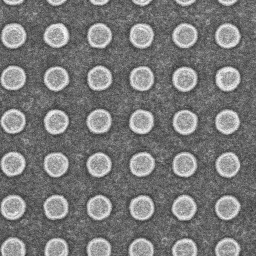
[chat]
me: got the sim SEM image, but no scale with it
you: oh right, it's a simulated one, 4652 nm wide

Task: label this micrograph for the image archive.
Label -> a regular array of raised bodies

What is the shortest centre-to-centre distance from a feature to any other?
773 nanometres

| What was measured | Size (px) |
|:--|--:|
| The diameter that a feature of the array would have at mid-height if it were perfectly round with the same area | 23.1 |